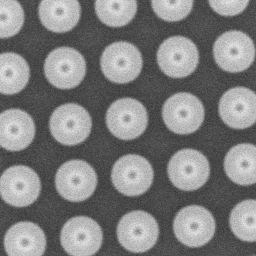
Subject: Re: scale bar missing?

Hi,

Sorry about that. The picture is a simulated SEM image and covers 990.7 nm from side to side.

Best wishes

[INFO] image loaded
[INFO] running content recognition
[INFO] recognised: an array of small figures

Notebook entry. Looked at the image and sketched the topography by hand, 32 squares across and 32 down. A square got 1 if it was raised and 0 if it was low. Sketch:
11000111110011111001111100111110
11100111110011111001111100011100
11100111110001110000010000000000
11100011100000000000000000000000
10000000000000000000000000001110
00000000000000110000111100011111
00000011110001111000111110011111
11100011110001111100111110011111
11110011111001111100111100001110
11110011110001111000011000000000
11100001110000000000000000000000
11000000000000000000000000001111
00000000000000011000011110001111
00000001110000111100111110011111
11110011111001111100111110001111
11110011111001111100011110001110
11110011111000111100001100000000
11110001110000000000000000000000
01100000000000000000000000000111
00000000000000001000001110001111
00000000111000111110011111001111
01110001111100111110011111001111
11111001111100111110011111000111
11111001111100011100001110000000
11111000111000000000000000000000
01110000000000000000000000000011
00000000000000001100001111000111
00000000011100011110001111100111
01111000111110011111001111100111
01111100111110011111001111100011
01111100111110011110000110000000
01111000111100000100000000000000